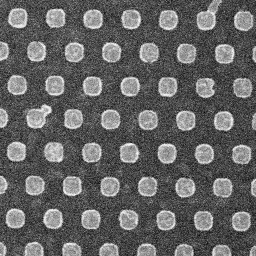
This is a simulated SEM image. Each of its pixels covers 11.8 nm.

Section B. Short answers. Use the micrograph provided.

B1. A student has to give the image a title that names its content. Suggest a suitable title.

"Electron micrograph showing a regular array of raised bodies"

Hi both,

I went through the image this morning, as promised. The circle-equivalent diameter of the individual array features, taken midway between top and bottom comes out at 222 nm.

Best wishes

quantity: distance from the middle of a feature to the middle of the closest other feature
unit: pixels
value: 37.5